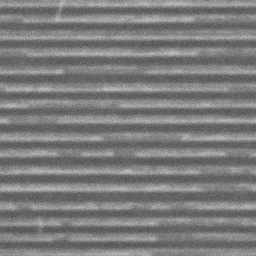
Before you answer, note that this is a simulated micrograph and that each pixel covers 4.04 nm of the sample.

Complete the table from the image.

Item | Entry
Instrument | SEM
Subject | parallel lines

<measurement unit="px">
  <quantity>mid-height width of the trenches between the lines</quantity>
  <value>10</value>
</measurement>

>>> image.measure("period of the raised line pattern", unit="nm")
67.8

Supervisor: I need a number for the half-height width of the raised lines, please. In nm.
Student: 24.7